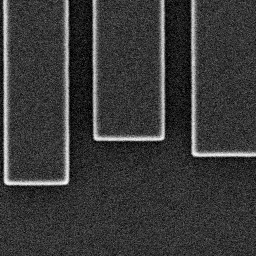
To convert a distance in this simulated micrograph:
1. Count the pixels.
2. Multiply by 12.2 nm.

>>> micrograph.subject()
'groups of lines, slits or small figures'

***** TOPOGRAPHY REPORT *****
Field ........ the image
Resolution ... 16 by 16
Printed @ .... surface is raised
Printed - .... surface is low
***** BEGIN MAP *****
@@@@--@@@@--@@@@
@@@@--@@@@--@@@@
@@@@--@@@@--@@@@
@@@@--@@@@--@@@@
@@@@--@@@@--@@@@
@@@@--@@@@--@@@@
@@@@--@@@@--@@@@
@@@@--@@@@--@@@@
@@@@--@@@@--@@@@
@@@@--------@@@@
@@@@------------
-@@@------------
----------------
----------------
----------------
----------------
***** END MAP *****